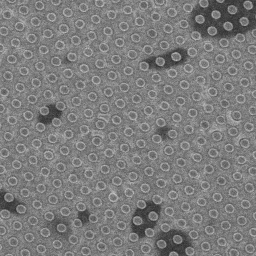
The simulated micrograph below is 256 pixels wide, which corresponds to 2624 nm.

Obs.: a regular array of raised bodies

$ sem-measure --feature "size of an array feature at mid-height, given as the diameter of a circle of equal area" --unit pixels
8.88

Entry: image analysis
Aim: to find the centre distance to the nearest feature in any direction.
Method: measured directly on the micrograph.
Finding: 169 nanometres